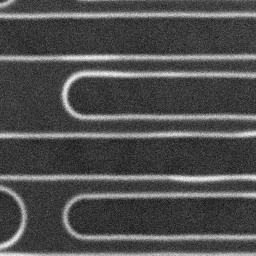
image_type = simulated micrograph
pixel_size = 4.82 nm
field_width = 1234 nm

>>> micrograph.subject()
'groups of lines, slits or small figures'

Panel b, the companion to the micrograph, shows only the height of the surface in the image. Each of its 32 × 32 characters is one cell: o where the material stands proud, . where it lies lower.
oooooooooooooooooooooooooooooooo
oooooooooooooooooooooooooooooooo
................................
................................
................................
................................
................................
oooooooooooooooooooooooooooooooo
oooooooooooooooooooooooooooooooo
oooooooooo......................
ooooooooo.......................
oooooooo........................
oooooooo........................
ooooooooo.......................
oooooooooo.....ooo.......oooo...
oooooooooooooooooooooooooooooooo
oooooooooooooooooooooooooooooooo
................................
................................
................................
................................
................................
oooooooooooooooooooooooooooooooo
oooooooooooooooooooooooooooooooo
..oooooooooooo..................
..ooooooo.......................
...ooooo........................
...ooooo........................
...oooooo.......................
..ooooooooo.....................
.ooooooooooooooooooooooooooooooo
oooooooooooooooooooooooooooooooo